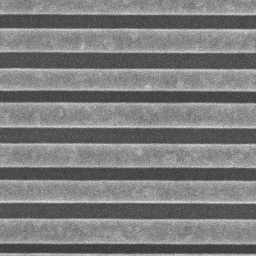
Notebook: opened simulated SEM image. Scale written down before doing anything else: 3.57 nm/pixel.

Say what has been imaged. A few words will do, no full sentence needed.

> parallel lines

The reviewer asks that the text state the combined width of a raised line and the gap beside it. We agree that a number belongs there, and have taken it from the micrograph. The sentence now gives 136 nm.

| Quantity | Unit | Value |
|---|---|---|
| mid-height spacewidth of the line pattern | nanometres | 54.9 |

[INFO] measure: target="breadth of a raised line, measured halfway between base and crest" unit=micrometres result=0.0817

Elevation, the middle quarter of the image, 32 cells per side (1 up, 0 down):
00000000000000000000000000000000
00000000000000000001111110111111
11111111111111111111111111111111
11111111111111111111111111111111
11111111111111111111111111111111
11111111111111111111111111111111
00000000000000000000000000000000
00000000000000000000000000000000
00000000000000000000000000000000
00000000000000000000000000000000
11111111111111111111111111111111
11111111111111111111111111111111
11111111111111111111111111111111
11111111111111111111111111111111
11111111111111111111111111111111
11111111111111111111111111111111
00000000000000000000000000000000
00000000000000000000000000000000
00000000000000000000000000000000
00000000000000000000000000000000
11111111111111111111111111111111
11111111111111111111111111111111
11111111111111111111111111111111
11111111111111111111111111111111
11111111111111111111111111111111
11111111111111111111111111111111
00000000000000000000000000000000
00000000000000000000000000000000
00000000000000000000000000000000
11111111111111111111111111111111
11111111111111111111111111111111
11111111111111111111111111111111